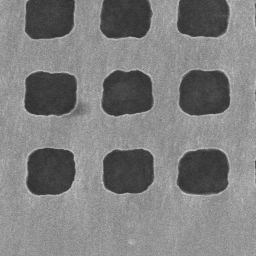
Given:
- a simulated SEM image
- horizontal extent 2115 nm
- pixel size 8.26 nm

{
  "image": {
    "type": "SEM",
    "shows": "holes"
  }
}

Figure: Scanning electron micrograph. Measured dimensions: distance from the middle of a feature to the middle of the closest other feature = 76.7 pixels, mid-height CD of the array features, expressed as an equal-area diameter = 419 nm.